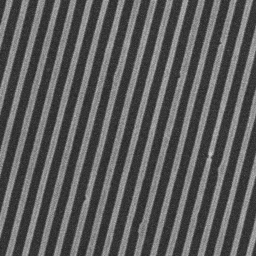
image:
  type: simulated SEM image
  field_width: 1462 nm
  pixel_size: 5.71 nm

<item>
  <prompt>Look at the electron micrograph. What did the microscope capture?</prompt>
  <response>parallel lines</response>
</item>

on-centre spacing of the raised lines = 88.5 nanometers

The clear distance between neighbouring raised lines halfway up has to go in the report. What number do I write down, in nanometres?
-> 59.5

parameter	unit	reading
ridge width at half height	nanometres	29.7